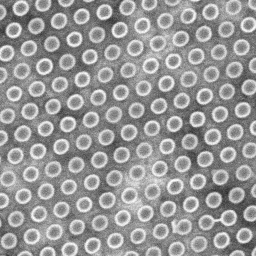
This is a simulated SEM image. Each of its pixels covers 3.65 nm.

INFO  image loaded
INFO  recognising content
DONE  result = a regular array of raised bodies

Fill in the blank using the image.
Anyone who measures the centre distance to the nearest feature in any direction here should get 23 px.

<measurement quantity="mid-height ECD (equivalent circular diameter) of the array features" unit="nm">54.8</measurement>